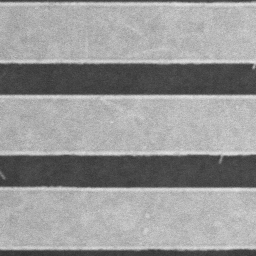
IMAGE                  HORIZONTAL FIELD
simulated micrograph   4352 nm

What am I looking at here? lines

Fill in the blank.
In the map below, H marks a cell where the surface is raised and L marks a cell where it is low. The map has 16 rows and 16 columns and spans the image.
HHHHHHHHHHHHHHHH
HHHHHHHHHHHHHHHH
HHHHHHHHHHHHHHHH
HHHHHHHHHHHHHHHH
LLLLLLLLLLLLLLLL
LLLLLLLLLLLLLLLL
HHHHHHHHHHHHHHHH
HHHHHHHHHHHHHHHH
HHHHHHHHHHHHHHHH
HHHHHHHHHHHHHHHH
LLLLLLLLLLLLLLLL
LLLLLLLLLLLLLLLL
HHHHHHHHHHHHHHHH
HHHHHHHHHHHHHHHH
HHHHHHHHHHHHHHHH
HHHHHHHHHHHHHHHH